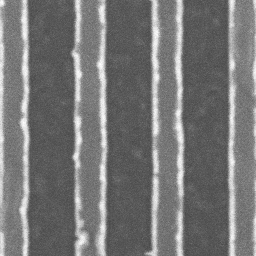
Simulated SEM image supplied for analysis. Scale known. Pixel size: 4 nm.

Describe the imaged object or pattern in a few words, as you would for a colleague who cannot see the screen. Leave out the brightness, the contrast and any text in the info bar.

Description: one or a few lines or trenches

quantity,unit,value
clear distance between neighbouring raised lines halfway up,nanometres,190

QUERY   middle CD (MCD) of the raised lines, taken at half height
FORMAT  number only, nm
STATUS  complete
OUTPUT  119